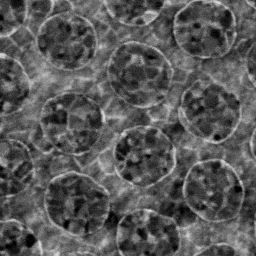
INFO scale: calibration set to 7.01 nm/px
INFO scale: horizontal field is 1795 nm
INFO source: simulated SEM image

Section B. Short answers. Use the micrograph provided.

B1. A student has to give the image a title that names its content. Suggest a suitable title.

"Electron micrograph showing raised bodies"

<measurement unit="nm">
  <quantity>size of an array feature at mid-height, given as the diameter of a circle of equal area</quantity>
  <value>432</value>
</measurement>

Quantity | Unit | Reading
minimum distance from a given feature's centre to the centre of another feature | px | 79.4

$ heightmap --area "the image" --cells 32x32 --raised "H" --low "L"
HHHLLLLLLLLLLHHHHHHHHLLLHHHHLLLH
HHHLLLLLHLLLLLHHHHHHLLHHHHHHHLLL
HHHLLLHHHHHLLLLHHHHLLLHHHHHHHLLL
HHLLLHHHHHHHLLLLLLLLLLHHHHHHHLLL
HLLLLHHHHHHHLLLLLLLLLLHHHHHHHLLL
LLLLLHHHHHHHLLLHHHLLLLHHHHHHHLLL
LLLLLHHHHHHHLLHHHHHHLLLHHHHHLLLH
HHLLLLHHHHHLLLHHHHHHHLLLLLLLLLLH
HHHLLLLHHHLLLHHHHHHHHLLLLLLLLLLH
HHHLLLLLLLLLLHHHHHHHHHLLLLLLLLLH
HHHHLLLLLLLLLLHHHHHHHLLLHHHLLLLL
HHHHLLLLLLLLLLHHHHHHHLLHHHHHHLLL
HHHLLLHHHHHLLLLHHHHHLLLHHHHHHHLL
HHHLLHHHHHHHHLLLLLLLLLHHHHHHHHLL
LLLLLHHHHHHHHLLLLLLLLLHHHHHHHHLL
LLLLLHHHHHHHHLLLLLLLLLLHHHHHHHLL
LLLLLHHHHHHHHLLLHHHHLLLLHHHHHLLL
HHLLLLHHHHHHLLLHHHHHHLLLLLHHLLLH
HHHLLLLHHHHLLLHHHHHHHHLLLLLLLLLH
HHHHLLLLLLLLLLHHHHHHHHLLLLLLLLLL
HHHHLLLLLLLLLLHHHHHHHHLLHHHHLLLL
HHHHLLLLLLLLLLLHHHHHHLLLHHHHHLLL
HHHHLLLHHHHHLLLHHHHHLLLHHHHHHHLL
HHHLLLHHHHHHHLLLLLLLLLLHHHHHHHLL
HLLLLLHHHHHHHHLLLLLLLLLHHHHHHHLL
LLLLLLHHHHHHHHLLLLLLLLLHHHHHHHLL
LLLLLLHHHHHHHHLLLHHLLLLLHHHHHHLL
LLLLLLHHHHHHHLLHHHHHHHLLLLHHLLLL
HHHHLLLLHHHHLLLHHHHHHHLLLLLLLLLL
HHHHLLLLLLLLLLLHHHHHHHHLLLLLLLLL
HHHHHLLLLLLLLLLHHHHHHHHLLLLHLLLL
HHHHHLLLLLLLLLLHHHHHHHLLLHHHHHLL